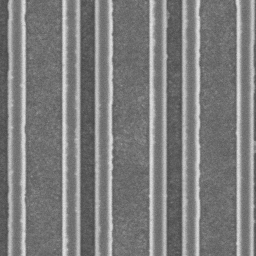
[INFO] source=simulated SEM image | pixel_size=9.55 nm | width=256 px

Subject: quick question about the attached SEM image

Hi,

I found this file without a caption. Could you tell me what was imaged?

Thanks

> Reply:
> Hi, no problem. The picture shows lines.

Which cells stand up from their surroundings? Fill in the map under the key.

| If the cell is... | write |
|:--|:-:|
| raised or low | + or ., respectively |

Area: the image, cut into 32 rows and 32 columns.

.++.....++..++.....++..++.....++
.++.....++..++.....++..++.....++
.++.....++..++.....++..++.....++
.++.....++..++.....++..++.....++
.++.....++..++.....++..++.....++
.++.....++..++.....++..++.....++
.++.....++..++.....++..++.....++
.++.....++..++.....++..++.....++
.++.....++..++.....++..++.....++
.++.....++..++.....++..++.....++
.++.....++..++.....++..++.....++
.++.....++..++.....++..++.....++
.++.....++..++.....++..++.....++
.++.....++..++.....++..++.....++
.++.....++..++.....++..++.....++
.++.....++..++.....++..++.....++
.++.....++..++.....++..++.....++
.++.....++..++.....++..++.....++
.++.....++..++.....++..++.....++
.++.....++..++.....++..++.....++
.++.....++..++.....++..++.....++
.++.....++..++.....++..++.....++
.++.....++..++.....++..++.....++
.++.....++..++.....++..++.....++
.++.....++..++.....++..++.....++
.++.....++..++.....++..++.....++
.++.....++..++.....++..++.....++
.++.....++..++.....++..++.....++
.++.....++..++.....++..++.....++
.++.....++..++.....++..++.....++
.++.....++..++.....++..++.....++
.++.....++..++.....++..++.....++